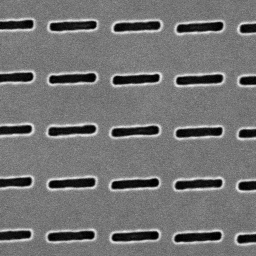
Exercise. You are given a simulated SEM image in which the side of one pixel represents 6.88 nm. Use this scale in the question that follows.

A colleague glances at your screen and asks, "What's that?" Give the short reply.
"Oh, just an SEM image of a regular array of holes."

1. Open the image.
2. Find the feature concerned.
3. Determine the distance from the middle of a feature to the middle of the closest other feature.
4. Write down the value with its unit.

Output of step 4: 0.361 micrometres